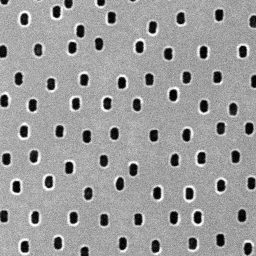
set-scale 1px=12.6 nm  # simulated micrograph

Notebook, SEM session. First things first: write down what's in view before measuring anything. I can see a regular array of holes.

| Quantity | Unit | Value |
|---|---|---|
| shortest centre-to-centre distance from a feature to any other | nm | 349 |